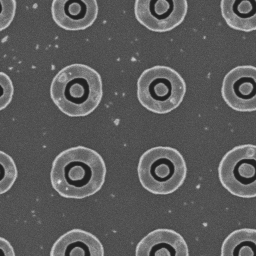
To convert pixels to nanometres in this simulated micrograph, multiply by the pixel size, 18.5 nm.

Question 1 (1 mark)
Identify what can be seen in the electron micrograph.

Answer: ring-shaped raised bodies with a dot in the middle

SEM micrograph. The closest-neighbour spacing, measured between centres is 1.51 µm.